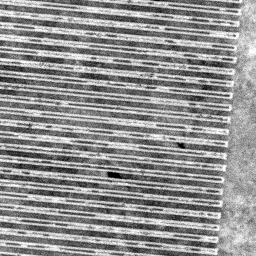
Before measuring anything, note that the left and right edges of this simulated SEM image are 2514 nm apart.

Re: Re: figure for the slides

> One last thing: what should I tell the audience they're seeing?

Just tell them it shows parallel lines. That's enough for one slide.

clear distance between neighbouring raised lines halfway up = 0.0721 um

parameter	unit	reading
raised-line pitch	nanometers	118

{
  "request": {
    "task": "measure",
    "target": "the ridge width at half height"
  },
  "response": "45.2 nm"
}